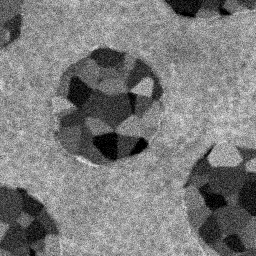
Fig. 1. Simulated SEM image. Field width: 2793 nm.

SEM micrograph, raised bodies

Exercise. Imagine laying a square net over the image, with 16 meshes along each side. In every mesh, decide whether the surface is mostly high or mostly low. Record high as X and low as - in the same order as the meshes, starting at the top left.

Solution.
X----------XXXXX
X---------------
X---------------
-----XXX--------
----XXXXXX------
---XXXXXXX------
---XXXXXXX------
---XXXXXXX------
---XXXXXXX------
----XXXXX----XXX
------------XXXX
X-----------XXXX
XX---------XXXXX
XXX-X-------XXXX
XXXX--------XXXX
XXXX---------XXX